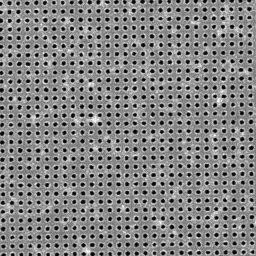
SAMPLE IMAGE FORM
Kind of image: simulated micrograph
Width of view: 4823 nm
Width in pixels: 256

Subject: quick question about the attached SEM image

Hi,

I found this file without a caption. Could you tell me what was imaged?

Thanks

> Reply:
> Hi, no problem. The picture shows a regular array of holes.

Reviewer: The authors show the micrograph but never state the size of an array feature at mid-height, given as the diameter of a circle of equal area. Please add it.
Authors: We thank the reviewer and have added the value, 85.1 nm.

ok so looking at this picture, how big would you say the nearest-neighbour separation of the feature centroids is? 160 nanometres